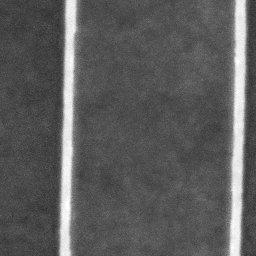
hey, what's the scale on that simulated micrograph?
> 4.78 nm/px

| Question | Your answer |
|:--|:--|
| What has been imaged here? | one or a few lines or trenches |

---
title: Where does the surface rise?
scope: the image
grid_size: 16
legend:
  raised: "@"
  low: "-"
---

----@@@@@@@@@@@-
----@@@@@@@@@@@-
----@@@@@@@@@@@-
----@@@@@@@@@@@-
----@@@@@@@@@@@-
----@@@@@@@@@@@-
----@@@@@@@@@@@-
----@@@@@@@@@@@-
----@@@@@@@@@@@-
----@@@@@@@@@@@-
----@@@@@@@@@@@-
----@@@@@@@@@@@-
----@@@@@@@@@@@-
----@@@@@@@@@@@-
----@@@@@@@@@@@-
----@@@@@@@@@@@-